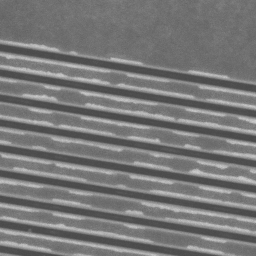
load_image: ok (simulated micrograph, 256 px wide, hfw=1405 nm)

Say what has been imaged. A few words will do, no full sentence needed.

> parallel lines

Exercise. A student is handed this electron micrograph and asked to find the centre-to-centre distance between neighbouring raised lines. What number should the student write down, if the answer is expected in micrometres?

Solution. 0.136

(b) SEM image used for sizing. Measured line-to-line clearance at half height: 48.1 nm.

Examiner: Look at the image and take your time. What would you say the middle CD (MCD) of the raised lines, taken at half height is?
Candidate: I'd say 87.3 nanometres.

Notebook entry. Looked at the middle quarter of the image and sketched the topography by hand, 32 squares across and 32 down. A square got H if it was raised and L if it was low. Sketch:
HHHHHLLLLLLLLLLLLLLLHHHHHHHHHHHH
HHHHHHHHHHHLLLLLLLLLLLLLLLHHHHHH
HHHHHHHHHHHHHHHHHHLLLLLLLLLLLLLL
HHHHHHHHHHHHHHHHHHHHHHHHLLLLLLLL
LLLLLLHHHHHHHHHHHHHHHHHHHHHHHHLL
LLLLLLLLLLLLHHHHHHHHHHHHHHHHHHHH
HHHLLLLLLLLLLLLLLLHHHHHHHHHHHHHH
HHHHHHHHLLLLLLLLLLLLLLLLHHHHHHHH
HHHHHHHHHHHHHHHLLLLLLLLLLLLLLLLH
HHHHHHHHHHHHHHHHHHHHHLLLLLLLLLLL
LLLLHHHHHHHHHHHHHHHHHHHHHHHHLLLL
LLLLLLLLLLHHHHHHHHHHHHHHHHHHHHHH
HHLLLLLLLLLLLLLLLHHHHHHHHHHHHHHH
HHHHHHHHLLLLLLLLLLLLLLLHHHHHHHHH
HHHHHHHHHHHHHHLLLLLLLLLLLLLLLHHH
HHHHHHHHHHHHHHHHHHHHHLLLLLLLLLLL
LLLHHHHHHHHHHHHHHHHHHHHHHHHLLLLL
LLLLLLLLLHHHHHHHHHHHHHHHHHHHHHHH
LLLLLLLLLLLLLLLHHHHHHHHHHHHHHHHH
HHHHHHLLLLLLLLLLLLLLLHHHHHHHHHHH
HHHHHHHHHHHLLLLLLLLLLLLLLLLHHHHH
HHHHHHHHHHHHHHHHHHLLLLLLLLLLLLLL
LHHHHHHHHHHHHHHHHHHHHHHHLLLLLLLL
LLLLLLLHHHHHHHHHHHHHHHHHHHHHHHLL
LLLLLLLLLLLLLHHHHHHHHHHHHHHHHHHH
HHHLLLLLLLLLLLLLLLLLHHHHHHHHHHHH
HHHHHHHHHHLLLLLLLLLLLLLLLLHHHHHH
HHHHHHHHHHHHHHHHLLLLLLLLLLLLLLLL
HHHHHHHHHHHHHHHHHHHHHHLLLLLLLLLL
LLLLLLHHHHHHHHHHHHHHHHHHHHHHLLLL
LLLLLLLLLLLLHHHHHHHHHHHHHHHHHHHH
HHLLLLLLLLLLLLLLLLHHHHHHHHHHHHHH